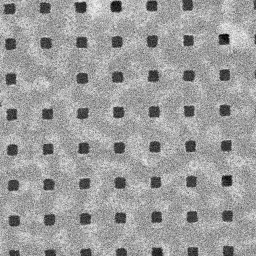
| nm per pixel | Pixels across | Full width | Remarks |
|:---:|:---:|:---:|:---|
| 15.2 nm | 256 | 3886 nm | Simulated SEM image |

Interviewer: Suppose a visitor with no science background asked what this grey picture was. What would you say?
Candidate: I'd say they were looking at a regular array of holes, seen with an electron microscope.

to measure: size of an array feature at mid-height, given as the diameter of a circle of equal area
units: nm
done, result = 198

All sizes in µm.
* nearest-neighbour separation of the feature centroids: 0.533